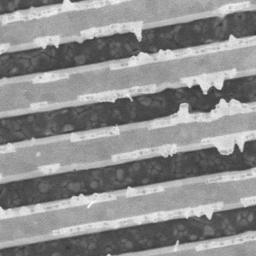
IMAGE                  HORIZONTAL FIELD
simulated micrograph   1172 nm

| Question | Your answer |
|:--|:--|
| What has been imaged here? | one or a few lines or trenches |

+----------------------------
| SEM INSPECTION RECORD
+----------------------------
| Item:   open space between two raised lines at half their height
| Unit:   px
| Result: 30.8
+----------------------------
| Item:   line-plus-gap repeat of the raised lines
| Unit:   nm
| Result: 293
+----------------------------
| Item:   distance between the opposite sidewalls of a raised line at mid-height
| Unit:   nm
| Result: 153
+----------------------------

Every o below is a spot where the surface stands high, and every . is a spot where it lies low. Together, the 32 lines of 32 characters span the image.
........oooooooooooooooooooooooo
....oooooooooooooooooooooooo....
oooooooooooooooooooooo..........
oooooooooooooooooo..............
oooooooooooo.....o..............
oooooo......................oooo
o...................oo.ooooooooo
................oooooooooooooooo
...........ooooooooooooooooooooo
.....oooooooooooooooooooooooo...
oooooooooooooooooooooo.o.ooo....
ooooooooooooooooooo......o......
oooooooooooooo...............o..
ooooo.................oo...ooooo
.....................ooooooooooo
...................ooooooooooooo
............oooooooooooooooooooo
.......oooooooooooooooooooooooo.
ooooooooooooooooooooooo....oo...
oooooooooooooooooo..............
oooooooooooo....................
ooooooo........................o
.........................ooooooo
................o..ooooooooooooo
..........oooooooooooooooooooooo
.......oooooooooooooooooooooooo.
ooooooooooooooooooooooooooo.....
oooooooooooooooooooo............
oooooooooooo....................
ooooooo.......................oo
o.........................oooooo
....................oooooooooooo